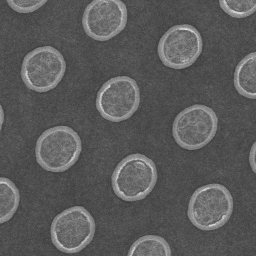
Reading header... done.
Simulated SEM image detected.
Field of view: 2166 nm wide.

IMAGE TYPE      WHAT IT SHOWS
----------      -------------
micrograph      a regular array of raised bodies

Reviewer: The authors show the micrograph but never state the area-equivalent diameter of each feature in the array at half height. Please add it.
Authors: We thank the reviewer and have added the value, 349 nm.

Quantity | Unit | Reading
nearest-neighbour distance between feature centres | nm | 676